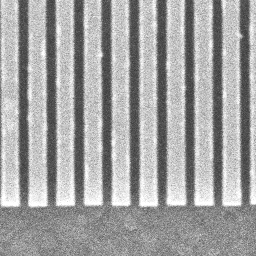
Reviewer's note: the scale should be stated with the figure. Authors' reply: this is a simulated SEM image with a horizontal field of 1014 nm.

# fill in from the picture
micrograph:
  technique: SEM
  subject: parallel lines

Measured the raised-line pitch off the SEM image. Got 110 nm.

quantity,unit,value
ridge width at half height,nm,66.3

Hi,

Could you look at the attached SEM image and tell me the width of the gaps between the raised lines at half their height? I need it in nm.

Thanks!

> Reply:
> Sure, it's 42.5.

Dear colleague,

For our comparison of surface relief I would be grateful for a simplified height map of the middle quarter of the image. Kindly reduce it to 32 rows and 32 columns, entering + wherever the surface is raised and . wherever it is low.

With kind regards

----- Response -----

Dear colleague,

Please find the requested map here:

++...++++...++++...++++...++++..
++...++++...++++...++++...++++..
++...++++...++++...++++...++++..
++...++++...++++...++++...++++..
++...++++...++++...++++...++++..
++...++++...++++...++++...++++..
++...++++...++++...++++...++++..
++...++++...++++...++++...++++..
++...++++...++++...++++...++++..
++...++++...++++...++++...++++..
++...++++...++++...++++...++++..
++...++++...++++...++++...++++..
++...++++...++++...++++...++++..
++...++++...++++...++++...++++..
++...++++...++++...++++...++++..
++...++++...++++...++++...++++..
++...++++...++++...++++...++++..
++...++++...++++...++++...++++..
++...++++...++++...++++...++++..
++...++++...++++...++++...++++..
++...++++...++++...++++...++++..
++...++++...++++...++++...++++..
++...++++...++++...++++...++++..
++...++++...++++...++++...++++..
++...++++...++++...++++...++++..
++...++++...++++...++++...++++..
++...++++...++++...++++...++++..
++...++++...++++...++++...++++..
++...++++...++++...++++...++++..
++...++++...++++...++++...++++..
++...++++...++++...++++...++++..
++...++++...++++...++++...++++..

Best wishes